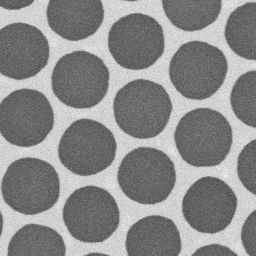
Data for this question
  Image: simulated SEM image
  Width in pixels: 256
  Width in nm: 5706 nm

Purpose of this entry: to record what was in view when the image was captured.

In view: a regular array of holes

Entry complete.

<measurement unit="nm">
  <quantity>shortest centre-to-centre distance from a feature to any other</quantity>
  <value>1500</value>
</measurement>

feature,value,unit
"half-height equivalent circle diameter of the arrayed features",1300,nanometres